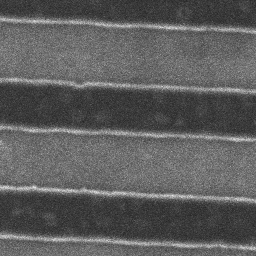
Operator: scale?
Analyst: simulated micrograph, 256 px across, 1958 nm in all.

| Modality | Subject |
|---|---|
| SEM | one or a few lines or trenches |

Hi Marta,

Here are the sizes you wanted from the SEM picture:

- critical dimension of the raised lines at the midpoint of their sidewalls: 380 nm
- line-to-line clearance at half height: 446 nanometers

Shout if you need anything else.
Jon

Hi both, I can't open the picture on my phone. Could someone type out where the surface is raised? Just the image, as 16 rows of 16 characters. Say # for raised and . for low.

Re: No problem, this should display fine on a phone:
################
......##########
................
................
................
#############...
################
################
..........######
................
................
................
################
################
################
...............#